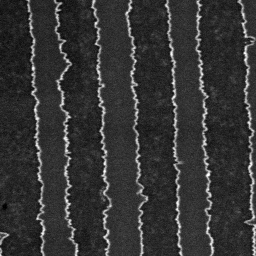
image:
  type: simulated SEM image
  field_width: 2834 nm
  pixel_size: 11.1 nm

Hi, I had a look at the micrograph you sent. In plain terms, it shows one or a few lines or trenches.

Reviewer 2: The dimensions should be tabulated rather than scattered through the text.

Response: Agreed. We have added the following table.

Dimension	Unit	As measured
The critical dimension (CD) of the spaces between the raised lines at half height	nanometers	427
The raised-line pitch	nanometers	765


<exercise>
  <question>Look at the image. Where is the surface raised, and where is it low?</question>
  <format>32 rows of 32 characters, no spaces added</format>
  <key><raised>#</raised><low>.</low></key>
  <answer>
....###.....####.....####.....##
....###.....####.....####.....##
....###.....####.....####......#
....###.....####.....####.....##
....###.....####.....####......#
....####....#####....####......#
....####....#####....####......#
....####....#####.....###......#
....####....#####.....###......#
....####....#####.....###......#
....###.....#####.....###......#
....####....#####.....###......#
.....###.....####.....####.....#
....####.....####.....####.....#
.....###.....####.....####.....#
.....###.....####.....####.....#
.....###.....####.....####.....#
.....###.....####.....####.....#
.....###.....####.....###......#
.....###.....####.....####.....#
.....###.....####.....####.....#
.....###.....####.....####.....#
.....####....####.....####......
.....###.....#####....####.....#
.....###.....#####....####.....#
.....###......####....####.....#
.....###.....#####....####.....#
.....####....#####....####.....#
.....####....#####....####......
#....####....#####....####......
.....####....#####....#####.....
.....#####...#####.....####.....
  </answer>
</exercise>